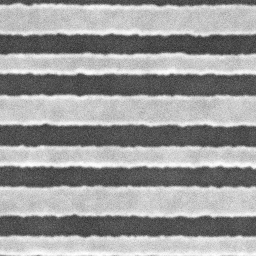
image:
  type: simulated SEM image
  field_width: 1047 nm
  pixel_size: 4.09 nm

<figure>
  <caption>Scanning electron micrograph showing lines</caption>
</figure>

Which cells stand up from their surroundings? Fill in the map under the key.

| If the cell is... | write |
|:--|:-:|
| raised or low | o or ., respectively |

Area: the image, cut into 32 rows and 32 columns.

................................
oooooooooooooooooooooooooooooooo
oooooooooooooooooooooooooooooooo
oooooooooooooooooooooooooooooooo
................................
................................
................................
oooooooooooooooooooooooooooooooo
oooooooooooooooooooooooooooooooo
................................
................................
................................
oooooooooooooooooooooooooooooooo
oooooooooooooooooooooooooooooooo
oooooooooooooooooooooooooooooooo
ooooo.oooooooooooooooooooooooooo
................................
................................
ooooooooooooooo..o..oo.oo...ooo.
oooooooooooooooooooooooooooooooo
oooooooooooooooooooooooooooooooo
................................
................................
oooo..ooooooooooooooooooo.o.oooo
oooooooooooooooooooooooooooooooo
oooooooooooooooooooooooooooooooo
oooooooooooooooooooooooooooooooo
................................
................................
................................
oooooooooooooooooooooooooooooooo
oooooooooooooooooooooooooooooooo